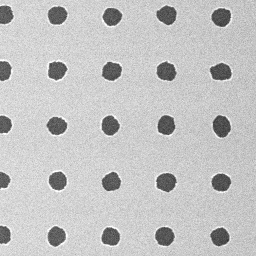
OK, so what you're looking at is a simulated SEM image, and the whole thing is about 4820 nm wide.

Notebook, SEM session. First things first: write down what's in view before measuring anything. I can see a regular array of holes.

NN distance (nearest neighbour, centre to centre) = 1.02 µm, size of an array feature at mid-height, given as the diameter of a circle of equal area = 376 nm